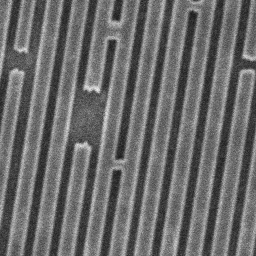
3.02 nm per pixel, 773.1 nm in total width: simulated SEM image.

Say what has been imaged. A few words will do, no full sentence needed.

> parallel lines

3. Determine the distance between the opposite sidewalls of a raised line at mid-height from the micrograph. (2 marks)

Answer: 45.6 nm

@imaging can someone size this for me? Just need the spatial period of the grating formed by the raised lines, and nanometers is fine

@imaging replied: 76.3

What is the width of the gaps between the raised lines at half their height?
29.4 nanometres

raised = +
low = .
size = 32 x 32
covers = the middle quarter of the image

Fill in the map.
+++...++++..++++...++++..++++...
+++...++++..++++...+++...++++..+
+++...+++...++++...+++...++++..+
+++...+++...++++..++++...+++...+
+++..++++...++++..++++...+++...+
+++..++++...++++..++++..++++...+
+++...+.+..++++...++++..++++...+
++.........++++...++++..++++..++
++.........++++...+++...++++..++
++.........++++..++++...+++...++
++.........++++..++++...+++...++
++.........++++..++++..++++...++
++........++++...++++..++++...++
+.........++++...++++..++++..+++
+.........++++..++++...++++..+++
+.........++++..++++...++++..+++
+.........++++..++++...+++...+++
+.........++++..++++...+++...+++
+.........+++...++++..++++...+++
.........++++...++++..++++...+++
...+++...++++...+++...++++..++++
...+++...++++..++++...++++..++++
...+++...++++..++++...+++...++++
..++++...++++..++++...+++...++++
..++++...++++++++++..++++...++++
..++++..++++++++++...++++...+++.
..++++..++++..++++...++++..++++.
..++++..++++...+++...++++..++++.
..+++...++++..++++...+++...++++.
..+++...+++...++++...+++...++++.
.++++...+++...++++..++++...++++.
.++++..++++...++++..++++...++++.